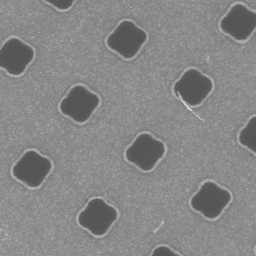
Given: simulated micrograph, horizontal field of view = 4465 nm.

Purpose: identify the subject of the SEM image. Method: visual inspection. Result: raised bodies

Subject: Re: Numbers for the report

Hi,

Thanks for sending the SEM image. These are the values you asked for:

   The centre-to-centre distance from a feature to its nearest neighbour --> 1.4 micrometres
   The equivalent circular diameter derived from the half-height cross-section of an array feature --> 659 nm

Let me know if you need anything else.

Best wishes